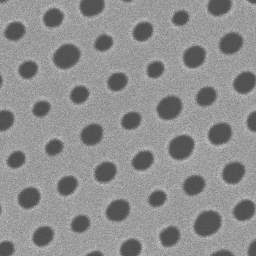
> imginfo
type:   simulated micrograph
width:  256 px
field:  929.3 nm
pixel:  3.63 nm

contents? a regular array of holes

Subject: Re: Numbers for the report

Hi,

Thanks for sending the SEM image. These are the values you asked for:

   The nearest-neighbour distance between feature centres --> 144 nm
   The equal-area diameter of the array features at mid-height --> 20.4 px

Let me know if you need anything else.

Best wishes